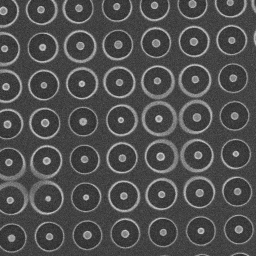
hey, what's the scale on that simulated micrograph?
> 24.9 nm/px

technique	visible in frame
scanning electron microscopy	an array of small figures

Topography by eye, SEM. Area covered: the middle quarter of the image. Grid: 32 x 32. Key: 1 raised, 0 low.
11111111111111111111111011111110
11100011111100001111100000111100
11000001111000000111000000011000
10000000110000000111000000011000
10000000110001000010000100011000
10000000110000000111000000011000
10000000111000000111000000011100
11000001111100001111100000111110
11100111111111111111111111111111
11111111111111111111111111111111
11111111111110011111100000111110
11100001111100000111000000011100
11000000111000000011000000011000
10000000111000000011000100001000
10000000111000000011000000001000
10000000111000000011000000011100
11000000111100000111100000011110
11100001111110011111111001111111
11111111111111111111111111111111
11111111111111111111111000111111
11110011111110000111100000011100
11100000111100000011100000001100
11000000111000000011100000001100
11000100011000100011000010001100
11000100011000000011100000001100
11000000111000000011100000011110
11100000111100001111111000111111
11111111111111111111111111111111
11111111111111111111111111111111
11111111111111001111110000011110
11100000111100000011100000001100
11000000011100000011100000001100